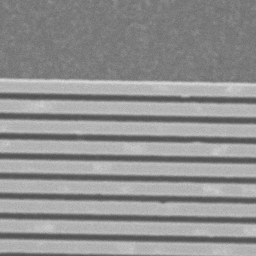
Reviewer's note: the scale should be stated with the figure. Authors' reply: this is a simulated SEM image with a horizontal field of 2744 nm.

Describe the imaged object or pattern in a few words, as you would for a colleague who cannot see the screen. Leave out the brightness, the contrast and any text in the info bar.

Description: parallel lines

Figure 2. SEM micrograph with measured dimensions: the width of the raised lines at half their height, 0.137 µm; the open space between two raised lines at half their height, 77.7 nanometres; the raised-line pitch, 0.214 um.